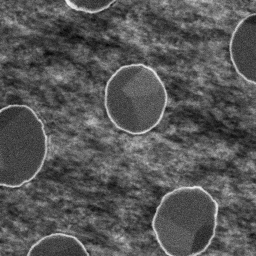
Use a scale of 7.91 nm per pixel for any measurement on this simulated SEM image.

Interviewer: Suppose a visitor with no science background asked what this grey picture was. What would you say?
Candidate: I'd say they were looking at raised bodies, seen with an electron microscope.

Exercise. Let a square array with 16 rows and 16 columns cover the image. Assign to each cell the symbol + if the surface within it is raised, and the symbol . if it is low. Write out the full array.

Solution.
.....++.........
...............+
..............++
..............++
.......+++.....+
.......+++......
.......+++......
++.....+++......
+++.............
+++.............
+++.............
+...............
..........+++...
..........++++..
..........+++...
..+++.....+++...